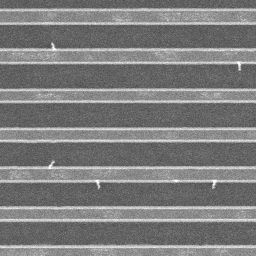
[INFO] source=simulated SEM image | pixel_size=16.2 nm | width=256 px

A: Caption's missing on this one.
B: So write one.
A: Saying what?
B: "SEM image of parallel lines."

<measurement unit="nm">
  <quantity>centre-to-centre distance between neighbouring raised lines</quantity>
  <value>638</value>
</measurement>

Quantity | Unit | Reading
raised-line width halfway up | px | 13.5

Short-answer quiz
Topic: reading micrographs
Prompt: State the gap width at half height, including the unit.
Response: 423 nm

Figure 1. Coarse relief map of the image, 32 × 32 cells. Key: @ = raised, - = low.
--------------------------------
@@@@@@@@@@@@@@@@@@@@@@@@@@@@@@@@
@@@@@@@@@@@@@@@@@@@@@@@@@@@@@@@@
--------------------------------
--------------------------------
--------------------------------
@@@@@@@@@@@@@@@@@@@@@@@@@@@@@@@@
@@@@@@@@@@@@@@@@@@@@@@@@@@@@@@@@
--------------------------------
--------------------------------
--------------------------------
@@@@@@@@@@@@@@@@@@@@@@@@@@@@@@@@
@@@@@@@@@@@@@@@@@@@@@@@@@@@@@@@@
--------------------------------
--------------------------------
--------------------------------
@@@@@@@@@@@@@@@@@@@@@@@@@@@@@@@@
@@@@@@@@@@@@@@@@@@@@@@@@@@@@@@@@
--------------------------------
--------------------------------
--------------------------------
@@@@@@@@@@@@@@@@@@@@@@@@@@@@@@@@
@@@@@@@@@@@@@@@@@@@@@@@@@@@@@@@@
--------------------------------
--------------------------------
--------------------------------
@@@@@@@@@@@@@@@@@@@@@@@@@@@@@@@@
@@@@@@@@@@@@@@@@@@@@@@@@@@@@@@@@
--------------------------------
--------------------------------
--------------------------------
@@@@@@@@@@@@@@@@@@@@@@@@@@@@@@@@